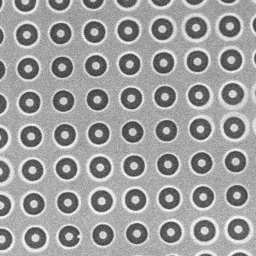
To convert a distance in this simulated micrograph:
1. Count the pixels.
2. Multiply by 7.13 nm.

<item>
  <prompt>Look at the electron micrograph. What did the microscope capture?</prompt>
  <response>an array of small figures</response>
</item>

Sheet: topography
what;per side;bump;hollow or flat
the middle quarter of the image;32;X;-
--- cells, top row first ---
--XXX--XX--XXX--X--XXX------XXX-
--XXX------XXX-----XXXX----XXXXX
--XXXX----XXXXX---XXXXXXX-XXXXXX
XXXXXXXXXXXXXXXXXXXXXXXXXXXXXXXX
XXXXXXXXXXXXXXXXXXXXXXXXXXXXXXXX
XXXXXXXXXXXXXXXXXXXXXXXX--XXXXXX
XXXXXXX---XXXXX----XXXX-----XXX-
--XXXX-----XXX-----XXX------XXX-
---XXX--X--XXX--XX--XX---X--XXX-
X--XXX--X--XXX------XXX-----XXX-
--XXXX-----XXXX----XXXXX---XXXXX
--XXXXX--XXXXXXXXXXXXXXXXXXXXXXX
XXXXXXXXXXXXXXXXXXXXXXXXXXXXXXXX
XXXXXXXXXXXXXXXXXXXXXXXXXXXXXXXX
XXXXXXXXXXXXXXXX--XXXXXX---XXXXX
--XXXXX----XXXX-----XXX-----XXX-
---XXX-----XXX---X--XXX--X--XXX-
X--XXX--X---XXX--X--XXX-----XXXX
X--XXX-----XXXX----XXXX-----XXXX
---XXXX----XXXXX--XXXXXXXXXXXXXX
-XXXXXXXXXXXXXXXXXXXXXXXXXXXXXXX
XXXXXXXXXXXXXXXXXXXXXXXXXXXXXXXX
XXXXXXXXXXXXXXXXXXXXXXXXX--XXXXX
--XXXXX----XXXX----XXXXX-----XXX
---XXX------XXX-----XXX------XXX
X--XXX--XX--XX---X--XXX--XX--XXX
X---XX---X--XXX-----XXXX----XXXX
---XXXX-----XXX-----XXXX----XXXX
---XXXX----XXXXXX-XXXXXXXXXXXXXX
XXXXXXXXXXXXXXXXXXXXXXXXXXXXXXXX
XXXXXXXXXXXXXXXXXXXXXXXXXXXXXXXX
XXXXXXXX---XXXXX---XXXXX----XXXX